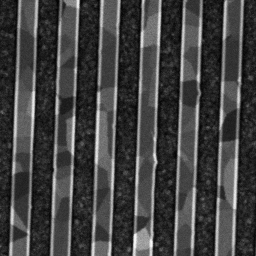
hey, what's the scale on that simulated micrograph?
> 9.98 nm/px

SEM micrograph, parallel lines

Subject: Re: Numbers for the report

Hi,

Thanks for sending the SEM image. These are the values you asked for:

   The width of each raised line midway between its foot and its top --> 171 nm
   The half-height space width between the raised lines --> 238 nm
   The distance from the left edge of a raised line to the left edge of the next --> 0.41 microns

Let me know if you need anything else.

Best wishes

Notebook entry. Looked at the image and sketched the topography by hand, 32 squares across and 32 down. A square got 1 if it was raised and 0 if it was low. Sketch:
00011000110001100011000110001100
00111000110001100011000110001100
00110000110001100011000110001100
00110000110001100011000110001100
00110001110001100011000110001100
00110001110001100011000110001100
00110001110001100011000110001100
00110001110011100011000110001100
00110001110011100011000110001100
00110001100011100011000110001100
00110001100011100011000110001100
00110001100011100111000110001100
00110001100011000111000110001100
00110001100011000111000110001100
00110001100011000111001110001100
00110001100011000110001110001100
00110001100011000110001110001100
00110001100011000110001110001100
00110001100011000110001110001100
00110001100011000110001100011100
00110001100011000110001100011100
00110001100011000110001100011100
00110001100011000110001100011000
00110001100011000110001100011000
00110001100011000110001100011000
00110001100011000110001100011000
00110001100011000110001100011000
00110001100011000110001100011000
01110001100011000110001100011000
01110001100011000110001100011000
01100001100011000110001100011000
01100001100011000110001100011000